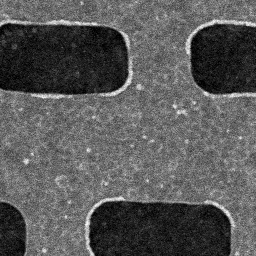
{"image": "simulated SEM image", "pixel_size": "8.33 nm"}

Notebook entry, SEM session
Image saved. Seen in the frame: holes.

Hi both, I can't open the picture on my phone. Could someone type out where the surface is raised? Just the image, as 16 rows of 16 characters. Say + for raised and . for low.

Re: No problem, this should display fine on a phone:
++++++++++++++++
.+++++++++++++++
........++++....
........++++....
........++++....
.......++++++...
++++++++++++++++
++++++++++++++++
++++++++++++++++
++++++++++++++++
++++++++++++++++
++++++++++++++++
++++++++++++++++
.+++++........++
..++++........++
..++++........++